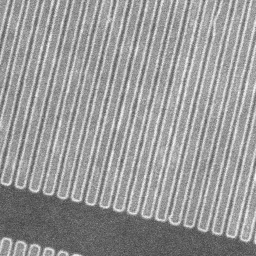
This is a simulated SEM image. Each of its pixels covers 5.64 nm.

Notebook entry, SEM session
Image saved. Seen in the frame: parallel lines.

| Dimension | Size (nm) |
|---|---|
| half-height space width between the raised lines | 42.6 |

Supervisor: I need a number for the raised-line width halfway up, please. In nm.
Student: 37.8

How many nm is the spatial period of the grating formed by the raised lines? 81.5